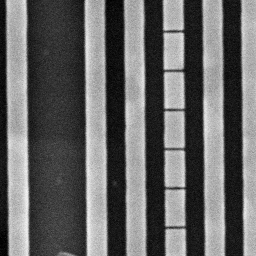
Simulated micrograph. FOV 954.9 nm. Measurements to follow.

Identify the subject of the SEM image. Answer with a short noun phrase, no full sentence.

wiring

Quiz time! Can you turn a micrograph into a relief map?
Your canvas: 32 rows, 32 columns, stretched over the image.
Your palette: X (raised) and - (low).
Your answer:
-XX--------XX---XX---XX--XXX--XX
-XX--------XX---XX---XX--XXX--XX
-XX--------XX---XX---XX--XXX--XX
-XX--------XX---XX---XX--XXX--XX
-XX--------XX---XX---XX--XXX--XX
-XX--------XX---XX---XX---XX--XX
-XX--------XX---XX---XX---XX--XX
-XX--------XX---XX---XX---XX--XX
-XX--------XX---XX---XX---XX--XX
-XX--------XX---XX---XX---XX--XX
-XX--------XX---XX---XX---XX--XX
-XX--------XX---XX---XX---XX--XX
-XX--------XX---XX---XX---XX--XX
-XX--------XX---XX---XX---XX--XX
-XX--------XX---XX---XX---XX--XX
-XX--------XX---XX---XX---XX--XX
-XX--------XX---XX---XX---XX--XX
-XX--------XX---XX---XX---XX--XX
-XX--------XX---XX---XX---XX--XX
-XX--------XX---XX---XX---XX--XX
-XX--------XX---XX---XX---XX--XX
-XX--------XX---XX---XX---XX--XX
-XX--------XX---XX---XX---XX---X
-XX--------XX---XX---XX---XX---X
-XX--------XX---XX---XX---XX---X
-XXX-------XX---XX---XX---XX---X
-XX--------XX---XX---XX---XX---X
-XX--------XX---XX---XX---XX---X
-XX--------XX---XX---XX---XX---X
-XXX-------XX---XX---XX---XX---X
-XXX-------XX---XX---XX---XX---X
-XXX-------XX---XX---XX---XX---X